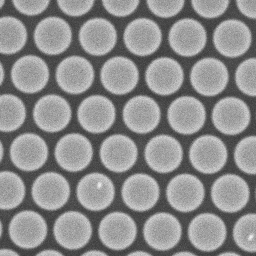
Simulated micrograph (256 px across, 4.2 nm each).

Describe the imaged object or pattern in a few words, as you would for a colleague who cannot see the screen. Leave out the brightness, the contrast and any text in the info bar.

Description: an array of small figures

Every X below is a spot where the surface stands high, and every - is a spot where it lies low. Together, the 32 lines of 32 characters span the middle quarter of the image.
XXXXXXX---XXXXXXXX---XXXXXXXX---
XXXXXXX--XXXXXXXXX---XXXXXXXX---
XXXXXXX--XXXXXXXXX--XXXXXXXXXX--
XXXXXXX--XXXXXXXXX--XXXXXXXXXX--
XXXXXXX---XXXXXXXX---XXXXXXXXX--
XXXXXX----XXXXXXXX---XXXXXXXX---
XXXXX------XXXXXX-----XXXXXX----
-------------XX---------XX------
------XXXX-------XXXX--------XXX
X----XXXXXXX----XXXXXXX----XXXXX
X---XXXXXXXX---XXXXXXXX----XXXXX
XX--XXXXXXXXX--XXXXXXXXX--XXXXXX
XX-XXXXXXXXXX--XXXXXXXXX--XXXXXX
XX--XXXXXXXXX--XXXXXXXXX--XXXXXX
X---XXXXXXXX---XXXXXXXXX--XXXXXX
-----XXXXXXX----XXXXXXX----XXXXX
------XXXX-------XXXXX------XXXX
--------------------------------
XXXXX------XXXXX-------XXXX-----
XXXXXX----XXXXXXX----XXXXXXX----
XXXXXXX--XXXXXXXXX---XXXXXXXX---
XXXXXXX--XXXXXXXXX--XXXXXXXXX---
XXXXXXX--XXXXXXXXX--XXXXXXXXX--X
XXXXXXX--XXXXXXXXX--XXXXXXXXX--X
XXXXXX----XXXXXXXX---XXXXXXXX---
XXXXXX----XXXXXXX----XXXXXXX----
-XXX--------XXXX-------XXXX-----
-------XX-----------------------
-----XXXXXX-----XXXXXX------XXXX
X---XXXXXXXX---XXXXXXXX----XXXXX
X--XXXXXXXXX---XXXXXXXX---XXXXXX
X--XXXXXXXXX---XXXXXXXXX--XXXXXX